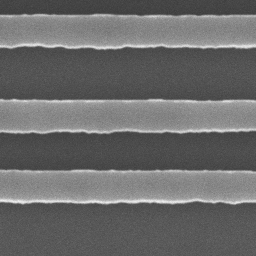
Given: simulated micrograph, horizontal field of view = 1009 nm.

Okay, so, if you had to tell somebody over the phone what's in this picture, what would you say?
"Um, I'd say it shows lines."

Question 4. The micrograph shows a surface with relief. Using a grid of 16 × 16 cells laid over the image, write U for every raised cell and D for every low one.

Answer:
DDDDDDDDDDDDDDDD
UUUUUUUUUUUUUUUU
UUUUUUUUUUUUUUUU
DDDDDDDDDDDDDDDD
DDDDDDDDDDDDDDDD
DDDDDDDDDDDDDDDD
UUUUUUUUUUUUUUUU
UUUUUUUUUUUUUUUU
DDDDDDDDDDDDDDDD
DDDDDDDDDDDDDDDD
DDDDDDDDDDDDDDDD
UUUUUUUUUUUUUUUU
UUUUUUUUUUUUUUUU
DDDDDDDDDDDDDDDD
DDDDDDDDDDDDDDDD
DDDDDDDDDDDDDDDD